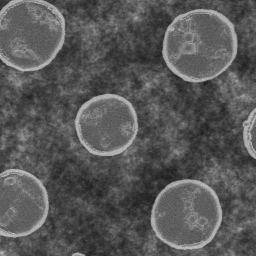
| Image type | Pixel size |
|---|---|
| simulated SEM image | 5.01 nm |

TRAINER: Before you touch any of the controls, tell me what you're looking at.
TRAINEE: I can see raised bodies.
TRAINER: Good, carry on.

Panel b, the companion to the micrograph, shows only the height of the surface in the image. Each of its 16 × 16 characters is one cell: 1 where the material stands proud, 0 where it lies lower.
1110000000000000
1111000000011100
1111000000111110
1110000000111110
0000000000011100
0000000000000000
0000011100000000
0000011100000001
0000011100000001
0000001000000000
0000000000000000
1110000000011000
1110000000111100
1110000000111100
1100000000111000
0000000000000000